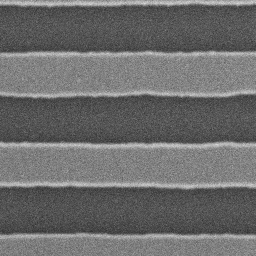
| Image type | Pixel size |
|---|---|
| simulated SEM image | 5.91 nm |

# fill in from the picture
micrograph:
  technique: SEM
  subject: lines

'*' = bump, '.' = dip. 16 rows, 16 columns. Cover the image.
................
................
................
****************
****************
****************
................
................
................
****************
****************
****************
................
................
................
****************